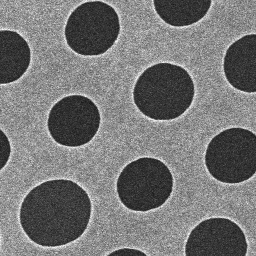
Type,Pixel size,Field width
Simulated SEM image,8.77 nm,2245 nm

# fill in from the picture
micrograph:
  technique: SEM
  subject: holes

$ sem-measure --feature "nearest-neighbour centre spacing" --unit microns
0.823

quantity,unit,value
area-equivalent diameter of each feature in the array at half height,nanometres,482